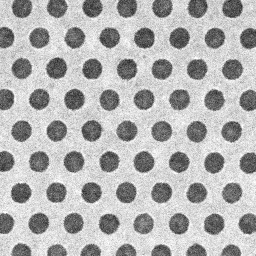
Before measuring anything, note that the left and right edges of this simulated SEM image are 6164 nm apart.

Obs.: a regular array of holes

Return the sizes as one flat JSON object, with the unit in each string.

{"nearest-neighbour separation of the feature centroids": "839 nanometers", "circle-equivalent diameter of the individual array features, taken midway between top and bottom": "537 nanometers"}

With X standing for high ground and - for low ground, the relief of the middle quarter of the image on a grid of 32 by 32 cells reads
-XXXX-----XXX-----XXXX-----XXXX-
-XXX------XXX------XXX-----XXXX-
XXXXX-----XXX-----XXXX-----XXXX-
XXXXX----XXXXX----XXXXX---XXXXX-
XXXXXXXXXXXXXXXXXXXXXXXXXXXXXXXX
XXXXXXXXXXXXXXXXXXXXXXXXXXXXXXXX
X---XXXXXX---XXXXXX---XXXXX---XX
-----XXXX-----XXXX----XXXX-----X
-----XXXX-----XXX------XXX------
-----XXXX-----XXX------XXX------
-----XXXX-----XXXX----XXXXX----X
X---XXXXXX---XXXXXX--XXXXXX---XX
XXXXXXXXXXXXXXXXXXXXXXXXXXXXXXXX
XXXXXXXXXXXXXXXXXXXXXXXXXXXXXXXX
XXXXX---XXXXXX---XXXXXX---XXXXXX
-XXXX----XXXX-----XXXX-----XXXX-
-XXX------XXX------XXX-----XXXX-
-XXX-----XXXX-----XXXX-----XXXX-
XXXXX----XXXXX----XXXX-----XXXX-
XXXXXXXXXXXXXXX-XXXXXXXX-XXXXXXX
XXXXXXXXXXXXXXXXXXXXXXXXXXXXXXXX
XXXXXXXXXXXXXXXXXXXXXXXXXXXXXXXX
X----XXXX----XXXXX----XXXXX----X
-----XXXX-----XXXX-----XXX-----X
-----XXXX-----XXX------XXX------
-----XXXX-----XXX------XXX-----X
X----XXXX----XXXXX----XXXXX----X
XXXXXXXXXXXXXXXXXXX-XXXXXXXXXXXX
XXXXXXXXXXXXXXXXXXXXXXXXXXXXXXXX
XXXXXX--XXXXXXX--XXXXXXX-XXXXXXX
XXXXX----XXXX-----XXXX-----XXXX-
-XXX------XXX-----XXXX-----XXXX-